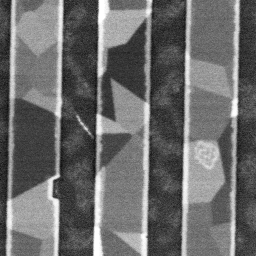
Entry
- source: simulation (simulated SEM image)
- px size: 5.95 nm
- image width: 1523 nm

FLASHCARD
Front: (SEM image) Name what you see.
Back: one or a few lines or trenches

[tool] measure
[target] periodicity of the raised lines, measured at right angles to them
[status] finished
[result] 524 nanometres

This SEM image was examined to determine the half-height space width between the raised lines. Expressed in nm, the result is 236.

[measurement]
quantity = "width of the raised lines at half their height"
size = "292 nm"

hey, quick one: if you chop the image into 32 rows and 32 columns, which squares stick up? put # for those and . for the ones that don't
..######.....######.....######..
..######.....######.....######..
..######.....######.....######..
..######.....######.....######..
..######.....#####......######..
..#####......######.....######..
..#####......#####......######..
..#####......######.....######..
..#####......#####.....#######..
..#####.....######.....######...
..#####.....######.....######...
..#####.....######.....######...
..#####.....######.....######...
..#####.....######.....######...
.######.....######.....######...
.######.....######.....######...
.######.....######.....######...
.######.....######.....######...
.######.....######.....######...
.######.....######.....######...
.######.....######.....######...
.######.....######.....######...
.######.....######.....######...
.#####......######.....######...
.#####......######.....######...
.######.....######.....######...
.######.....######.....######...
.######.....######.....######...
.######.....######.....######...
.######.....######.....######...
.######.....######.....######...
.######.....######.....######...